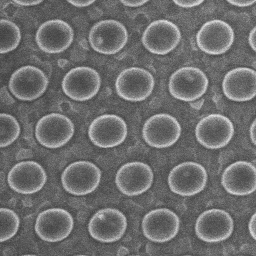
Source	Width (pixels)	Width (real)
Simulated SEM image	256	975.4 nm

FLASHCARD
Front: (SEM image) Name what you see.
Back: a regular array of raised bodies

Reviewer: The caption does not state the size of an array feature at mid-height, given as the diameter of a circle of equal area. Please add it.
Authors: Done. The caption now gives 0.132 µm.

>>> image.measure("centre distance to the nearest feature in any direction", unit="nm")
203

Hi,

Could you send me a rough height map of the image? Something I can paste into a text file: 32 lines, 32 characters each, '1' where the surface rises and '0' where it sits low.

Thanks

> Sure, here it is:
00010000011000001100001110000110
00000000000000000000000000000000
00000000000000000000000000000000
11000111100011100011110001111000
11000111100111110011110001111001
11000111100111110011110001111001
00000010000001000001100000110000
00000000000000000000000000000000
00010000000000000000000100000000
00111100111100011110001111001111
01111100111100011110011111001111
01111000111100011110011111001111
00000000000000001100000100000000
00000000000000000000000000000000
10000011000001000001100000110000
11000111100011110011110001111000
11000111100111110011110001111001
11000111000111100011110001111000
00000000000000000000000000000000
00000000000000000000000000000000
00111000011000001100000110000110
01111000111100011110011111001111
01111100111100011110011111001111
00111000111100011100011110001111
00000000000000000000000000000000
00000000000000000000000000000000
11000011000011100001100000110000
11000111100111110011110001111001
11000111100111110011110001111001
10000111000011100011110001110000
00000000000000000000000000000000
00000000000000000000000000000000